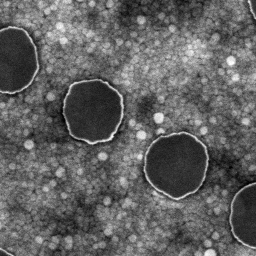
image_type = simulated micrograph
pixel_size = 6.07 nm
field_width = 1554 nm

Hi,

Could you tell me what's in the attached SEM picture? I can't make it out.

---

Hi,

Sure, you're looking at raised bodies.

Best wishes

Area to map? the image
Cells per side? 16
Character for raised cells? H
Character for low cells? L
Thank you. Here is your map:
LLLLLLLLLLLLLLLL
LLLLLLLLLLLLLLLL
HHLLLLLLLLLLLLLL
HHLLLLLLLLLLLLLL
HHLLLLLLLLLLLLLL
HHLLHHHLLLLLLLLL
LLLLHHHHLLLLLLLL
LLLLHHHHLLLLLLLL
LLLLLHHLLLHHLLLL
LLLLLLLLLHHHHLLL
LLLLLLLLLHHHHLLL
LLLLLLLLLHHHHLLL
LLLLLLLLLLLLLLLH
LLLLLLLLLLLLLLHH
LLLLLLLLLLLLLLLH
LLLLLLLLLLLLLLLL